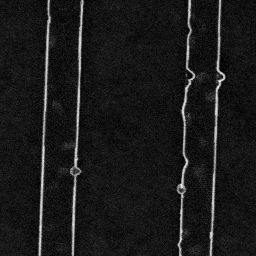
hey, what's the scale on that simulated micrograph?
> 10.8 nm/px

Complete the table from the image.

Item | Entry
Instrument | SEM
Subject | one or a few lines or trenches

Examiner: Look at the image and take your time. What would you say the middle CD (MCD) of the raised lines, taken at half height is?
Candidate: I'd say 359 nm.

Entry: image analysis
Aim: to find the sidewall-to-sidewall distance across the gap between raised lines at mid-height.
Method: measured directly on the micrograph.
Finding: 1150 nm